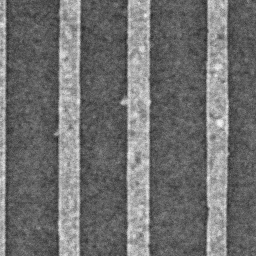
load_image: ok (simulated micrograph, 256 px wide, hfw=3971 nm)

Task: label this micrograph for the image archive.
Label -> one or a few lines or trenches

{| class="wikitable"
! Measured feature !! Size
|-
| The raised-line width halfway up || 0.283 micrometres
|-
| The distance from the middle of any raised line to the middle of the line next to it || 74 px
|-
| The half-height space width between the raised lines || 0.867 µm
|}